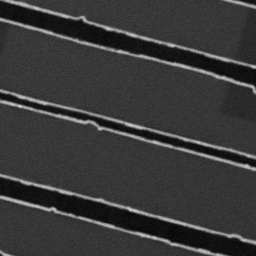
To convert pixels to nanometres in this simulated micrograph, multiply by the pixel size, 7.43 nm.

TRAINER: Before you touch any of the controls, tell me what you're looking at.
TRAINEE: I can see one or a few lines or trenches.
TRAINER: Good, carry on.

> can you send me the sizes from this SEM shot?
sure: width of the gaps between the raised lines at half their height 0.505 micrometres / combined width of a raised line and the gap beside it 632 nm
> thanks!